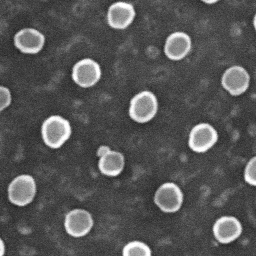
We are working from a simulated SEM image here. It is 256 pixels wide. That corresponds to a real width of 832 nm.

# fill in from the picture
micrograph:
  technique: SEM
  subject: a regular array of raised bodies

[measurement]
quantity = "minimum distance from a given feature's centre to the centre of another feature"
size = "211 nm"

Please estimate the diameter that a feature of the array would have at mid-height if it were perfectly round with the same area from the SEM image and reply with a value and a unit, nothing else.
86.4 nm